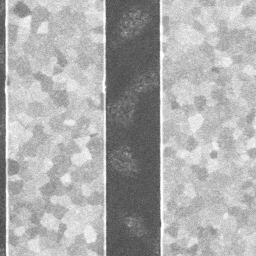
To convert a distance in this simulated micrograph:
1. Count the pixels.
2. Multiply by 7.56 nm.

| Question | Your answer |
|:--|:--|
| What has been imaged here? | one or a few lines or trenches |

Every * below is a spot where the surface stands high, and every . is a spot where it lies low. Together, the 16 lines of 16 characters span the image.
*******...******
*******...******
*******...******
*******...******
*******...******
*******...******
*******...******
*******...******
*******...******
*******...******
*******...******
*******...******
*******...******
*******...******
*******...******
*******...******